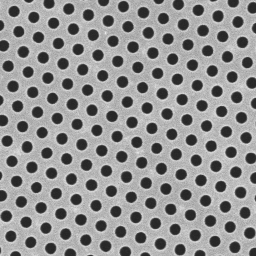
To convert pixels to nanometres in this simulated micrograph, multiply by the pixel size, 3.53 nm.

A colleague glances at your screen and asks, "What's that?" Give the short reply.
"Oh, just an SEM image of a regular array of holes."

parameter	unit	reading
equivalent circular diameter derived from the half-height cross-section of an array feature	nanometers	39.6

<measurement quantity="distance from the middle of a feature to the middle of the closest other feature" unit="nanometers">72.6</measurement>